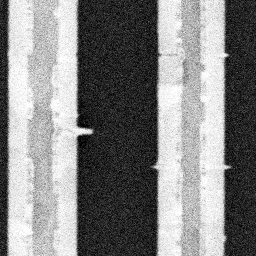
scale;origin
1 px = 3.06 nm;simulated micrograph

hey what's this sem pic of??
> one or a few lines or trenches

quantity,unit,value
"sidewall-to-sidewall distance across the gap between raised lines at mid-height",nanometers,309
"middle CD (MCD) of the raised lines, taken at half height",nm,146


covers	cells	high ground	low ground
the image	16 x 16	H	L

LHHHLLLLLLLHHLLL
LHHHLLLLLLLHHLLL
LHHHLLLLLLLHHLLL
LHHHLLLLLLLHHLLL
LHHHLLLLLLLHHLLL
LHHHLLLLLLLHHLLL
LHHHLLLLLLLHHLLL
LHHHLLLLLLLHHLLL
LHHHLLLLLLLHHLLL
LHHHLLLLLLLHHLLL
LHHHLLLLLLHHHLLL
LHHHLLLLLLLHHLLL
LHHHLLLLLLLHHLLL
LHHHLLLLLLLHHLLL
LHHHLLLLLLLHHLLL
LHHHLLLLLLLHHLLL